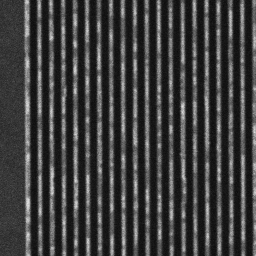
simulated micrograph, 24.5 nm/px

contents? parallel lines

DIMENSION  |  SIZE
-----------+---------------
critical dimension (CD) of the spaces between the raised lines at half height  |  8 px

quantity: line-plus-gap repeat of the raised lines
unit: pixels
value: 11.9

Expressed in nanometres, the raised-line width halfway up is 85.6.